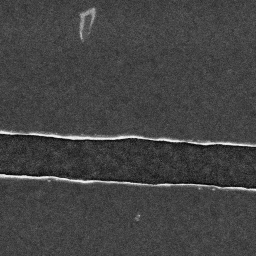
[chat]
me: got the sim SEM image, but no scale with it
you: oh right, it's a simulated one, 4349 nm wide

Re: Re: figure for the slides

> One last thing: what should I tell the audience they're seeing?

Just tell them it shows one or a few lines or trenches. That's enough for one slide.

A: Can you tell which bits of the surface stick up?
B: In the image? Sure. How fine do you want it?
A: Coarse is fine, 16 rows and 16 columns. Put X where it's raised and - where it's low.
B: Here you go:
XXXXXXXXXXXXXXXX
XXXXXXXXXXXXXXXX
XXXXXXXXXXXXXXXX
XXXXXXXXXXXXXXXX
XXXXXXXXXXXXXXXX
XXXXXXXXXXXXXXXX
XXXXXXXXXXXXXXXX
XXXXXXXXXXXXXXXX
---XXXXXXXXXXXXX
----------------
----------------
XXXXXXXXX-------
XXXXXXXXXXXXXXXX
XXXXXXXXXXXXXXXX
XXXXXXXXXXXXXXXX
XXXXXXXXXXXXXXXX